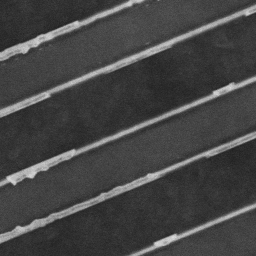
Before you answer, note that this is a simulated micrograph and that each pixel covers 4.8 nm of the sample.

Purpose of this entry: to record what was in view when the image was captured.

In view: one or a few lines or trenches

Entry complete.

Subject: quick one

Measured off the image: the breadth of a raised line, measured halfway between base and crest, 0.323 microns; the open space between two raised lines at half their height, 234 nm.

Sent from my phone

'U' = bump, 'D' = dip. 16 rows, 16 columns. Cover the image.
UUUUUUUDDDDDDDDD
UUUUUDDDDDDDDUUU
UUUDDDDDDDDUUUUU
UDDDDDDDDUUUUUUU
DDDDDDUUUUUUUUUU
DDDDUUUUUUUUUUUD
DUUUUUUUUUUUDDDD
UUUUUUUUUUDDDDDD
UUUUUUUDDDDDDDDU
UUUUUDDDDDDDDUUU
UUUDDDDDDDDUUUUU
DDDDDDDDUUUUUUUU
DDDDDDUUUUUUUUUU
DDDUUUUUUUUUUUDD
UUUUUUUUUUUUDDDD
UUUUUUUUUUDDDDDD